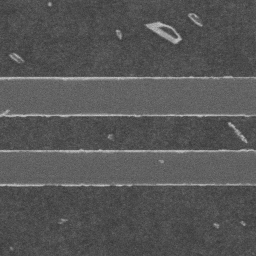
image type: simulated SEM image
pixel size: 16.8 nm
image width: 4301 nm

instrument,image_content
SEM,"lines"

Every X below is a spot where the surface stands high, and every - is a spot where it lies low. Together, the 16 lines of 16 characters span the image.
----------------
----------------
----------------
----------------
----------------
XXXXXXXXXXXXXXXX
XXXXXXXXXXXXXXXX
----------------
----------------
XXXXXXXXXXXXXXXX
XXXXXXXXXXXXXXXX
XXXXXXXXXXXXXXXX
----------------
----------------
----------------
----------------